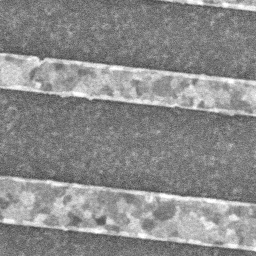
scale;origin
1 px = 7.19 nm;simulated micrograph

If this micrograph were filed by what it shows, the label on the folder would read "one or a few lines or trenches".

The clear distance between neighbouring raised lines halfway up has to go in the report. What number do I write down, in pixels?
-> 87.4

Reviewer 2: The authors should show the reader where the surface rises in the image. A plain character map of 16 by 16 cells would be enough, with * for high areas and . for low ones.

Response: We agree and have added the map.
...............*
................
................
**..............
**********......
****************
.........*******
................
................
................
................
****............
**************..
****************
......**********
...............*